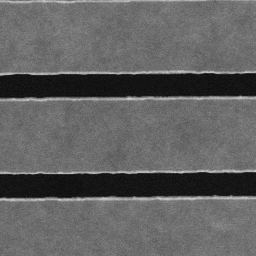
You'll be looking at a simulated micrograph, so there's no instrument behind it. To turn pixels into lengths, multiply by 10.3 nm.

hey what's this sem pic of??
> lines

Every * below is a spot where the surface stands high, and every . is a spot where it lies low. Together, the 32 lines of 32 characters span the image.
********************************
********************************
********************************
********************************
********************************
********************************
********************************
********************************
********************************
................................
................................
................................
********************************
********************************
********************************
********************************
********************************
********************************
********************************
********************************
********************************
*******************************.
................................
................................
................................
********************************
********************************
********************************
********************************
********************************
********************************
********************************